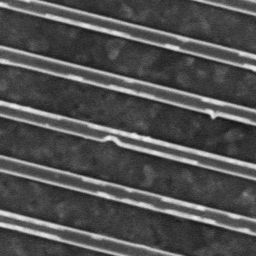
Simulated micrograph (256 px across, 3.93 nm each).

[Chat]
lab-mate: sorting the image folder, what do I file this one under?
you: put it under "parallel lines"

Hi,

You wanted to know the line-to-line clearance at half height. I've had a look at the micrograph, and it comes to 154 nanometres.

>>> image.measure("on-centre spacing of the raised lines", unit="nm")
209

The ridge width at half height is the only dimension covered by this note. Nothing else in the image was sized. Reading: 55.3 nm